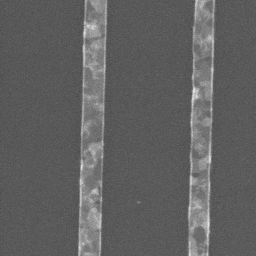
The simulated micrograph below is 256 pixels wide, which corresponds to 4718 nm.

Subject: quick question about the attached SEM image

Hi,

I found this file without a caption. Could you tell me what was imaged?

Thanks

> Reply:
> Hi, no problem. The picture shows one or a few lines or trenches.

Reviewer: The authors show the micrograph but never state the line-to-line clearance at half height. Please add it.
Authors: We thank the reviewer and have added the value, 1620 nanometers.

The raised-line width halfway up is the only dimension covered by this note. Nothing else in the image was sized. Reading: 0.373 microns